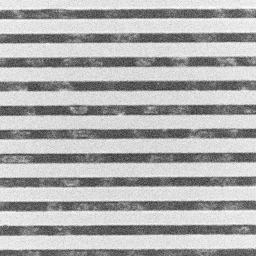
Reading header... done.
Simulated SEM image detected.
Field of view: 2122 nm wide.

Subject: parallel lines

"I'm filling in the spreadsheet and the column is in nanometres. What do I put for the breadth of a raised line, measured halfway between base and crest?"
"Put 114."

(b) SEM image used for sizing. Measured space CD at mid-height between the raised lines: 91.2 nanometers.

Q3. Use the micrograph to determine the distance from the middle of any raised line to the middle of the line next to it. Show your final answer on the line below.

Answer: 199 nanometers